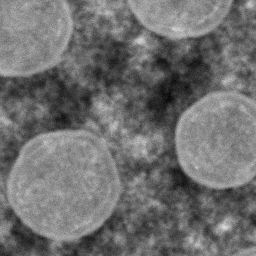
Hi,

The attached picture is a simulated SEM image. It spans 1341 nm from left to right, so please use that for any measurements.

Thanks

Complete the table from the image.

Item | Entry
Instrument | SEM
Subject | raised bodies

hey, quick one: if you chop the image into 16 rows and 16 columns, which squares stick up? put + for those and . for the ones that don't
++++....++++++..
++++.....+++++..
++++............
++++............
++..............
................
............++++
...........+++++
..++++.....+++++
.++++++....+++++
.++++++....+++++
.++++++......++.
.++++++.........
.++++++.........
..++++..........
................